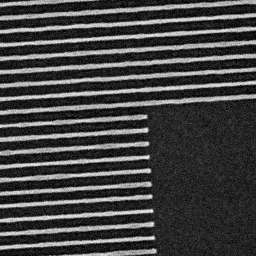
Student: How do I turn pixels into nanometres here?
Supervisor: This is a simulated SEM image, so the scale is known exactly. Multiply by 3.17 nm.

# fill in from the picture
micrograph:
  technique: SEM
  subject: parallel lines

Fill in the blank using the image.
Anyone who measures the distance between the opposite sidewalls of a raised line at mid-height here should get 12.3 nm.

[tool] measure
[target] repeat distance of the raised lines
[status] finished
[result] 42.7 nm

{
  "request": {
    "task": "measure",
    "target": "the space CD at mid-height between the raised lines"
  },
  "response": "0.0305 microns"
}